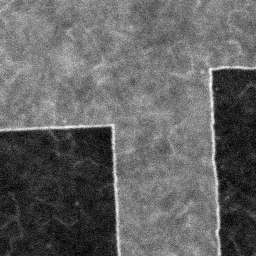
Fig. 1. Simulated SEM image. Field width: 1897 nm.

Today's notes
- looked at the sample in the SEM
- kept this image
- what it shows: one or a few lines or trenches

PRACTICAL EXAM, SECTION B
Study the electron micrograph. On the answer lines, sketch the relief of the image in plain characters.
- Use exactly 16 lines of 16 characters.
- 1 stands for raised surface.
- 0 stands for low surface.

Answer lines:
0000000000000000
0000000000000000
0000000000000000
0000000000000000
0000000000000111
0000000000000111
0000000000000111
0000000000000111
1111111000000111
1111111000000111
1111111000000111
1111111000000011
1111111000000011
1111111000000011
1111111000000011
1111111000000011